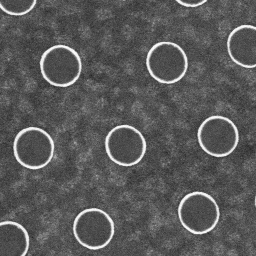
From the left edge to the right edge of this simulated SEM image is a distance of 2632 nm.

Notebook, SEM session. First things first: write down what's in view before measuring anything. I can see raised bodies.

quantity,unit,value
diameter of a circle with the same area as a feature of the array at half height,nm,401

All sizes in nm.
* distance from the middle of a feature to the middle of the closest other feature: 892